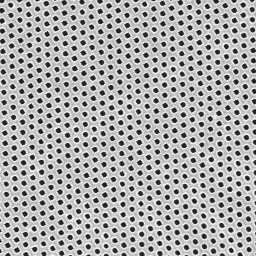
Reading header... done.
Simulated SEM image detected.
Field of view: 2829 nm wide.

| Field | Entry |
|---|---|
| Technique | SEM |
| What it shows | a regular array of holes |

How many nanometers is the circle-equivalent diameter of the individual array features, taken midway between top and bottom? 61.1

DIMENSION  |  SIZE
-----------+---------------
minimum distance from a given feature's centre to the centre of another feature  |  0.111 µm